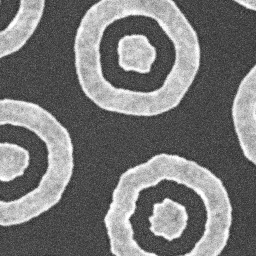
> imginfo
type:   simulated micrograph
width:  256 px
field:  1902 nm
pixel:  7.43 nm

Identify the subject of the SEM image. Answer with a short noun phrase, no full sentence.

ring-shaped raised bodies with a dot in the middle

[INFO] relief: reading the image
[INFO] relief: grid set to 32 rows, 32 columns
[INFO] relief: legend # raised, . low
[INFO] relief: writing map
...##.......##########..........
..###......############.........
..###.....####......###.........
.###......###.......####........
####......###........###........
###.......##...####...###.......
##.......###...####...###.......
..........##...####...###.......
..........##....###...###.......
..........###........###.......#
..........####.......###......##
...........#####...####.......##
............##########.......###
#####........########........###
######.......................###
..#####......................###
....####......................##
......###.....................#.
###...###.....................##
###...###...........#..........#
###...###.........######........
###...###.......##########......
#....####......#####..#####.....
.....###.......###......####....
...####.......###..........#....
#######.......###...##....###...
#####.........###..###....###...
###..........###...####...###...
..............##...####...#.....
..............##....##...###....
..............###........###....
..............####......###.....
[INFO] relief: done